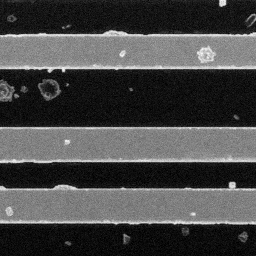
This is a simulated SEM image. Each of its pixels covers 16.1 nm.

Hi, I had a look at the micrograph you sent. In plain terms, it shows lines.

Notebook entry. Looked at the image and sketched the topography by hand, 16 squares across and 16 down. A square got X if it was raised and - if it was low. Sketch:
----------------
----------------
XXXXXXXXXXXXXXXX
XXXXXXXXXXXXXXXX
----------------
----------------
----------------
----------------
XXXXXXXXXXXXXXXX
XXXXXXXXXXXXXXXX
----------------
----------------
XXXXXXXXXXXXXXXX
XXXXXXXXXXXXXXXX
----------------
----------------